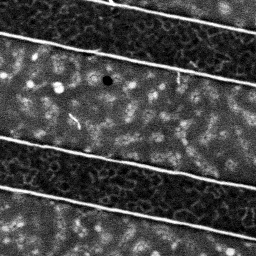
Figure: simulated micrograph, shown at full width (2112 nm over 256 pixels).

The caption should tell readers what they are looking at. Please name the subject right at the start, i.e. one or a few lines or trenches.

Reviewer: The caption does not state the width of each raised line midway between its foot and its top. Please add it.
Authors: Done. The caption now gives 404 nm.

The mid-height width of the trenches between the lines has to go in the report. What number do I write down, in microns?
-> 0.839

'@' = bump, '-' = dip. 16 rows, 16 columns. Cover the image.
@@@@@@@@--------
@@@@@@@@@@@@@---
--@@@@@@@@@@@@@@
-------@@@@@@@@@
------------@@@@
----------------
----------------
----------------
----------------
@@@@------------
@@@@@@@@@@------
@@@@@@@@@@@@@@--
----@@@@@@@@@@@@
---------@@@@@@@
--------------@@
----------------